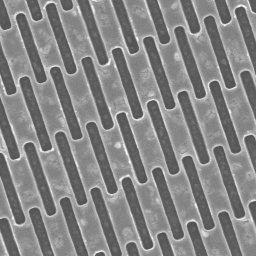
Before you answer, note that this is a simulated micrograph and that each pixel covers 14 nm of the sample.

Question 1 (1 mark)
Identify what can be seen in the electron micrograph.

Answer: a regular array of holes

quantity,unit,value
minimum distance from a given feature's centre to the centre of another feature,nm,450